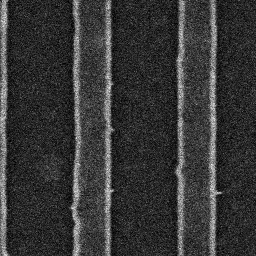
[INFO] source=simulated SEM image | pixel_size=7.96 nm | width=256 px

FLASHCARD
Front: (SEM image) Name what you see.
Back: one or a few lines or trenches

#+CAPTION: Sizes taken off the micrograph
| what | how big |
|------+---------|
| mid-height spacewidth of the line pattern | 0.581 µm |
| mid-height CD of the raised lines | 0.255 microns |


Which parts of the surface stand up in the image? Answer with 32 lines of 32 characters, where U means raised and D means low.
UDDDDDDDDDUUUDDDDDDDDDDUUUUDDDDD
DDDDDDDDDUUUUDDDDDDDDDDUUUUDDDDD
DDDDDDDDDDUUUDDDDDDDDDDUUUUDDDDD
DDDDDDDDDDUUUDDDDDDDDDDUUUUDDDDD
DDDDDDDDDDUUUDDDDDDDDDDUUUUDDDDD
DDDDDDDDDDUUUDDDDDDDDDDUUUUDDDDD
DDDDDDDDDDUUUDDDDDDDDDDUUUUDDDDD
DDDDDDDDDDUUUDDDDDDDDDUUUUUDDDDD
DDDDDDDDDDUUUDDDDDDDDDUUUUUDDDDD
DDDDDDDDDDUUUDDDDDDDDDDUUUUDDDDD
DDDDDDDDDDUUUUDDDDDDDDDUUUUDDDDD
DDDDDDDDDDUUUDDDDDDDDDDUUUUDDDDD
DDDDDDDDDDUUUDDDDDDDDDDUUUUDDDDD
DDDDDDDDDDUUUDDDDDDDDDDUUUUDDDDD
DDDDDDDDDDUUUDDDDDDDDDDUUUUDDDDD
DDDDDDDDDDUUUUDDDDDDDDDUUUUDDDDD
DDDDDDDDDDUUUUDDDDDDDDDUUUUDDDDD
DDDDDDDDDDUUUDDDDDDDDDDUUUUDDDDD
DDDDDDDDDDUUUDDDDDDDDDDUUUUDDDDD
DDDDDDDDDDUUUDDDDDDDDDDUUUUDDDDD
DDDDDDDDDDUUUDDDDDDDDDDUUUUDDDDD
DDDDDDDDDDUUUDDDDDDDDDUUUUUDDDDD
DDDDDDDDDDUUUDDDDDDDDDDUUUUDDDDD
DDDDDDDDDUUUUUDDDDDDDDDUUUUDDDDD
DDDDDDDDDDUUUUDDDDDDDDDUUUUDDDDD
DDDDDDDDDUUUUDDDDDDDDDDUUUUDDDDD
DDDDDDDDDUUUUDDDDDDDDDDUUUUDDDDD
DDDDDDDDDDUUUDDDDDDDDDDUUUUDDDDD
DDDDDDDDDDUUUDDDDDDDDDDUUUUDDDDD
DDDDDDDDDDUUUDDDDDDDDDDUUUUDDDDD
DDDDDDDDDDUUUDDDDDDDDDDUUUUDDDDD
UDDDDDDDDDUUUDDDDDDDDDDUUUUDDDDD